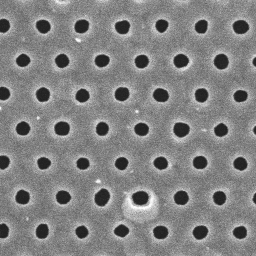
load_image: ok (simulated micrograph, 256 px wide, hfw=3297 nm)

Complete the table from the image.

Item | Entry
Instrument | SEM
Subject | a regular array of holes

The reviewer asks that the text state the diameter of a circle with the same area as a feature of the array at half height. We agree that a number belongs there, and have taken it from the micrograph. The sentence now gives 184 nanometers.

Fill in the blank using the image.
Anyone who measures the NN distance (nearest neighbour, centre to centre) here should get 500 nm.